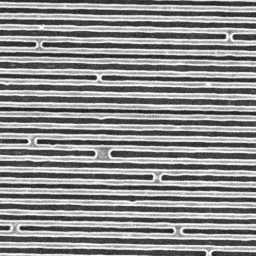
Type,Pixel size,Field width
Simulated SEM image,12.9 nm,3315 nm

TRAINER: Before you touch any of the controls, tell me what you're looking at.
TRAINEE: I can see parallel lines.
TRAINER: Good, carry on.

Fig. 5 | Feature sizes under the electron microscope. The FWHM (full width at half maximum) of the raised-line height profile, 59.9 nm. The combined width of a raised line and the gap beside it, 0.141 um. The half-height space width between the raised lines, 84.2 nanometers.